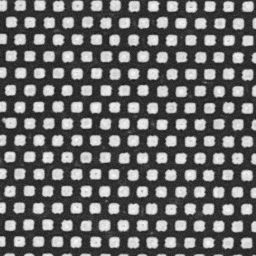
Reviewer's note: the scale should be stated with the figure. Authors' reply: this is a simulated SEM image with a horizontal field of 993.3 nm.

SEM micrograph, a regular array of raised bodies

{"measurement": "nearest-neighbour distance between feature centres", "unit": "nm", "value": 72.2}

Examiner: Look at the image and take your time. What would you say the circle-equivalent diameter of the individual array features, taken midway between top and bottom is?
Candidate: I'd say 42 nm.